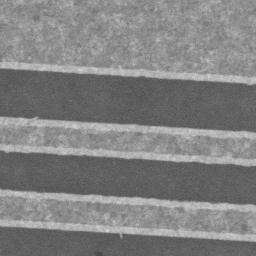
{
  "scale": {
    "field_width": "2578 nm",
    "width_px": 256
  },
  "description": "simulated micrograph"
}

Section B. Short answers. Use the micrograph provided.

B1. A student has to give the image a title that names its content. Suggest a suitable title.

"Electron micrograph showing one or a few lines or trenches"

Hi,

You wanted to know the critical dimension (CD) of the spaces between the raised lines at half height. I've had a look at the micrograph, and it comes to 0.513 micrometres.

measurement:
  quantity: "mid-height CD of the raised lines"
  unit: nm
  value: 282